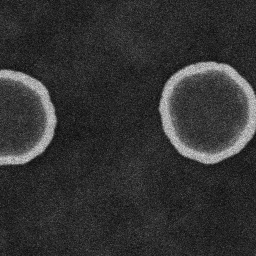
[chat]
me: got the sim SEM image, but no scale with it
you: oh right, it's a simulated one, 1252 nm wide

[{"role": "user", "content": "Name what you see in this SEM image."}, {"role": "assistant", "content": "raised bodies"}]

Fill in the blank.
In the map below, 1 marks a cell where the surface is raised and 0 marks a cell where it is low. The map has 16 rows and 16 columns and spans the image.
0000000000000000
0000000000000000
0000000000000000
0000000000000000
0000000000001100
1100000000011110
1110000000111111
1110000000111111
1110000000011110
1100000000001100
0000000000000000
0000000000000000
0000000000000000
0000000000000000
0000000000000000
0000000000000000